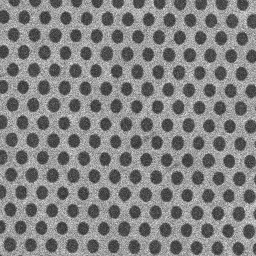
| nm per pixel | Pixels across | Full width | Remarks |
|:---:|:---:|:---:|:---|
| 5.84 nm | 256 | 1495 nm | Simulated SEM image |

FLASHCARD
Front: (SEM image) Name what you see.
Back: a regular array of holes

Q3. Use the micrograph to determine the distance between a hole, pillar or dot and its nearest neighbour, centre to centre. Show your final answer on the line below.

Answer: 20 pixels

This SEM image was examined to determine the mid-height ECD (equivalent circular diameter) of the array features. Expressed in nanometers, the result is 75.8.